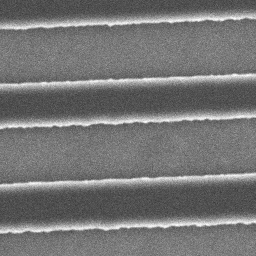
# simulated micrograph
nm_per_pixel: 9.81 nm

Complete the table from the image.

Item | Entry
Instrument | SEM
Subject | lines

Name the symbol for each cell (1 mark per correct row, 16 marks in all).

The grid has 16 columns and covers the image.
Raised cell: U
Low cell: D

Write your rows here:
UUUUUUUUUUUUUUUU
UUUUUUUUDDDDDDDD
DDDDDDDDDDDDDDDD
DDDDDDDDDDDDDDDD
DDDDDDDDDDDDDDDD
UUUUUUUUUUUUUUUU
UUUUUUUUUUUUUUUU
UUUUUUUUUUUUDDDD
DDDDDDDDDDDDDDDD
DDDDDDDDDDDDDDDD
DDDDDDDDDDDDDDDD
UUUUUUUUUUUUUUUU
UUUUUUUUUUUUUUUU
UUUUUUUUUUUUUUUU
UDDDDDDDDDDDDDDD
DDDDDDDDDDDDDDDD